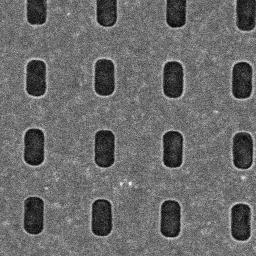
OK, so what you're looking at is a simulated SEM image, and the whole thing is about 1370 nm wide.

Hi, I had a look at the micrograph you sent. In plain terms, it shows a regular array of holes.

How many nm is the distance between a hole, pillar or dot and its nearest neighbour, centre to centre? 366